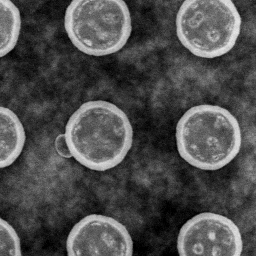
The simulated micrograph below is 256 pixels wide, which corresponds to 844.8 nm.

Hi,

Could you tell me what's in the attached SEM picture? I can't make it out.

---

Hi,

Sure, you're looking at raised bodies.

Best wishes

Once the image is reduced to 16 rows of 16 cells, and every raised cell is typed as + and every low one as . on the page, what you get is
+...++++...++++.
+...++++...++++.
+....+++...++++.
................
................
................
................
+....+++...++++.
+...++++...++++.
+....+++...++++.
................
................
................
................
+....+++...++++.
+...++++...++++.